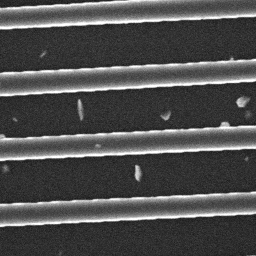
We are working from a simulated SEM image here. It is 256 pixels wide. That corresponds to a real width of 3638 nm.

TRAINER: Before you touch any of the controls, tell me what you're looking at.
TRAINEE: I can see lines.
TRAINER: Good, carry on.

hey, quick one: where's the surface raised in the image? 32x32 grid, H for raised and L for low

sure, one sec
LLLLLLLLLLLHHHHHHHHHHHHHHHHHHHHH
HHHHHHHHHHHHHHHHHHHHHHHHHHHHHHHH
HHHHHHHHHHHHHHHHHHHHHHLLLLLLLLLL
HHLLLLLLLLLLLLLLLLLLLLLLLLLLLLLL
LLLLLLLLLLLLLLLLLLLLLLLLLLLLLLLL
LLLLLLLLLLLLLLLLLLLLLLLLLLLLLLLL
LLLLLLLLLLLLLLLLLLLLLLLLLLLLLLLL
LLLLLLLLLLLLLLLLLLLLLLLLLLLLLLLH
LLLLLLLLLLLLLLHHHHHHHHHHHHHHHHHH
HHHHHHHHHHHHHHHHHHHHHHHHHHHHHHHH
HHHHHHHHHHHHHHHHHHHHHHHHHHLLLLLL
HHHHHHHHLLLLLLLLLLLLLLLLLLLLLLLL
LLLLLLLLLLLLLLLLLLLLLLLLLLLLLLLL
LLLLLLLLLLLLLLLLLLLLLLLLLLLLLLLL
LLLLLLLLLLLLLLLLLLLLLLLLLLLLLLLL
LLLLLLLLLLLLLLLLLLLLLLLLLLLLLLLL
LLLLLLLLLLLLLLLLLLLHHHHHHHHHHHHH
HHHHHHHHHHHHHHHHHHHHHHHHHHHHHHHH
HHHHHHHHHHHHHHHHHHHHHHHHHHHHHHHH
HHHHHHHHHHHLLLLLLLLLLLLLLLLLLLLL
LLLLLLLLLLLLLLLLLLLLLLLLLLLLLLLL
LLLLLLLLLLLLLLLLLLLLLLLLLLLLLLLL
LLLLLLLLLLLLLLLLLLLLLLLLLLLLLLLL
LLLLLLLLLLLLLLLLLLLLLLLLLLLLLLLL
LLLLLLLLLLLLLLLLLLLLLLLLHHHHHHHH
LHHHHHHHHHHHHHHHHHHHHHHHHHHHHHHH
HHHHHHHHHHHHHHHHHHHHHHHHHHHHHHHH
HHHHHHHHHHHHHHHLLLLLLLLLLLLLLLLL
LLLLLLLLLLLLLLLLLLLLLLLLLLLLLLLL
LLLLLLLLLLLLLLLLLLLLLLLLLLLLLLLL
LLLLLLLLLLLLLLLLLLLLLLLLLLLLLLLL
LLLLLLLLLLLLLLLLLLLLLLLLLLLLLLLL